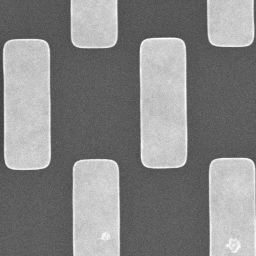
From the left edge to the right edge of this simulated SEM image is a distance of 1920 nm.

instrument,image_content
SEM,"groups of lines, slits or small figures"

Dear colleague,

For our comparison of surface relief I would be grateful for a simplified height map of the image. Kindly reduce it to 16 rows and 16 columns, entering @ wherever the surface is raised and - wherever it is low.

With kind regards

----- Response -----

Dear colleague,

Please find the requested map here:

----@@@------@@@
----@@@------@@@
-@---@@--@@--@@@
@@@------@@@----
@@@------@@@----
@@@------@@@----
@@@------@@@----
@@@------@@@----
@@@------@@@----
@@@------@@@----
-@@--@@--@@--@@@
-----@@------@@@
-----@@------@@@
-----@@------@@@
-----@@------@@@
-----@@------@@@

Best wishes